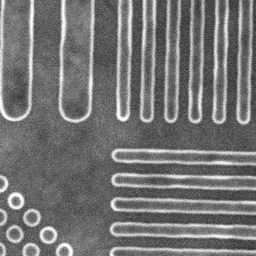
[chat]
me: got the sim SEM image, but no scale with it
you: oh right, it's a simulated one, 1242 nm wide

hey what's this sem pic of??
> groups of lines, slits or small figures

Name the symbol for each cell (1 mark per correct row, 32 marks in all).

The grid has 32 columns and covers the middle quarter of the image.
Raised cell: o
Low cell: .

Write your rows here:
ooooooo.......oo...oooo...oo...o
ooooooo.......oo...ooo....oo...o
ooooooo......ooo...ooo....oo....
ooooooo......ooo...ooo....oo...o
ooooooo......ooo...ooo...ooo...o
ooooooo......ooo...ooo...ooo...o
ooooooo......ooo...ooo...ooo...o
ooooooo......ooo...ooo...ooo...o
ooooooo......ooo...ooo...ooo...o
ooooooo.......oo...ooo...ooo...o
ooooooo.......oo...ooo...ooo...o
ooooooo.......oo...ooo...ooo...o
oooooo........oo...ooo...ooo...o
oooooo........oo...ooo...ooo...o
..........................o.....
................................
................................
................................
................................
................................
................................
.............oo.................
............oooooooooooooooooooo
............oooooooooooooooooooo
...................ooooooooooooo
................................
................................
.............ooo................
............oooooooooooooooooooo
............oooooooooooooooooooo
................oooooooooooooooo
................................